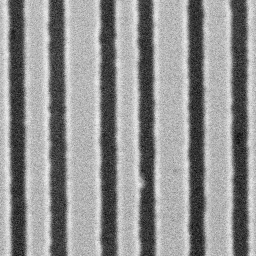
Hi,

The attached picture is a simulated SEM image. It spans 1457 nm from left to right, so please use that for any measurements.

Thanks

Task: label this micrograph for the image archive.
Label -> lines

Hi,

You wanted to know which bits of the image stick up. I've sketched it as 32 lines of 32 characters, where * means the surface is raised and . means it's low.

*..***..****...**..****...***..*
*..***..****...**..****...***..*
*..***..****...**..****...***..*
*..***..****...**..****...***..*
*..***..****...**..****...***..*
*..***..****...**..****...***..*
*..***..****...**..****...***..*
*..***..****...**..****...***..*
*..***..****...**..****...***..*
*..***..****...**..****...***..*
*..***..****...**..****...***..*
*..***..****...**..****...***..*
*..***..****...**..****...***..*
*..***..****...**..****...***..*
*..***..****...**..****...***..*
*..***..****...**..****...***..*
*..***..****...**..****...***..*
*..***..****...**..****...***..*
*..***...***...**...***...***..*
*..***..****...**...***...***..*
*..***...***...**...***...***..*
*..***...***...**...***...***..*
*..***...***...**...***...***..*
*..***...***...**...***...***..*
*..***...***...**...***...***..*
*..***...***...**...***...***..*
*..***...***...**...***...***..*
*..***...***...**...***...***..*
*..***...***...**...***...***..*
*..***...***...**...****..***..*
*..***...***...**...****..***..*
*..***...****..**...***...***..*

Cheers